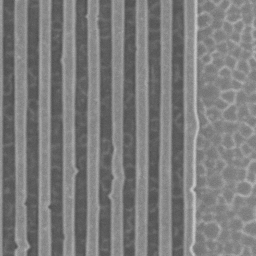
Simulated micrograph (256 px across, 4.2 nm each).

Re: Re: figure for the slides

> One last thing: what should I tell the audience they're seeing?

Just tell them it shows parallel lines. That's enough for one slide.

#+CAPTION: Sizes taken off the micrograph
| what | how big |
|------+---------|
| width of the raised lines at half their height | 0.0436 microns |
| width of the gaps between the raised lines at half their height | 57.7 nm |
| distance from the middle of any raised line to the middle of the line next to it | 102 nm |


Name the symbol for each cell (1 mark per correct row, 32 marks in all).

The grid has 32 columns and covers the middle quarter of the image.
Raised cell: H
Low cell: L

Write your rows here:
HHHLLLHHHLLLHHHLLLHHHLLLLHHLLLHH
HHHLLLHHHLLLHHHLLLHHHLLLHHHLLLHH
HHHLLLHHHLLLHHHLLLHHHLLLHHHLLLHH
HHHLLLHHHLLLHHHLLLHHHLLLLHHLLLHH
HHHLLLHHHLLLHHHLLLHHHLLLLHHLLLHH
HHHLLLHHHLLLHHHLLLHHHLLLLHHLLLHH
HHHLLLHHHLLLHHHLLLHHHLLLLHHLLLHH
HHHLLLHHHLLLHHHLLLHHHLLLLHHLLLHH
HHHLLLHHHLLLHHHLLLHHHLLLLHHLLLHH
HHLLLLHHHLLLHHHLLLHHHLLLLHHLLLHH
HHLLLLHHHLLLHHHLLLHHHLLLHHHLLLHH
HHLLLLHHHLLLHHHLLLHHHLLLHHHLLLHH
HHLLLLHHHLLLHHHLLLHHHLLLHHHLLLHH
HHLLLLHHHLLLHHHLLLHHHLLLHHHLLLHH
HHLLLLHHHLLLHHHLLLHHHLLLHHHLLLHH
HHHLLLHHHLLLHHHLLLHHHLLLHHHLLLHH
HHHLLLHHHLLLHHHLLLHHHLLLHHHLLLHH
HHLLLLHHHLLLHHHLLLHHHLLLHHHLLLHH
HHLLLLHHHLLLHHHLLLHHHLLLHHHLLLHH
HHLLLLHHHLLLHHHLLLHHHLLLHHHLLLHH
HHLLLLHHHLLLHHLLLLHHHLLLHHHLLLHH
HHLLLLHHHLLLLHLLLLHHHLLLHHHLLLHH
HHLLLLHHHLLLHHLLLLHHHLLLHHLLLLHH
HHLLLLHHHLLLHHLLLLHHHLLLHHLLLLHH
HHLLLLHHHLLLHHLLLLHHHLLLHHHLLLHH
HHHLLLHHHLLLHHHLLLHHHLLLHHHLLLHH
HHHLLLHHHLLLHHHLLLHHHLLLHHHLLLHH
HHHLLLHHHLLLHHHLLLHHHLLLHHHLLLHH
HHLLLLHHLLLLLHHLLLHHHLLLHHHLLLHH
HHLLLLHHLLLLHHHLLLHHHLLLHHHLLLHH
HHLLLLHHLLLLHHHLLLHHHLLLHHHLLLHH
HHLLLLHHLLLLHHLLLLHHHLLLHHHLLLHH